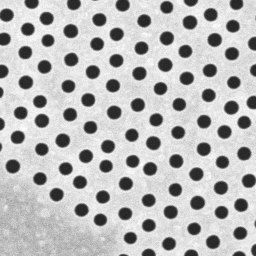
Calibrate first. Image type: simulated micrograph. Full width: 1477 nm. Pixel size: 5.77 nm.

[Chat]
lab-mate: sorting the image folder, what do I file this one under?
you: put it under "a regular array of holes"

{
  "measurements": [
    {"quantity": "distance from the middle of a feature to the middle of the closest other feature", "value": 133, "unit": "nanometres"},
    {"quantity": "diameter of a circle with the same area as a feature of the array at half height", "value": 14.2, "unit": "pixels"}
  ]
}